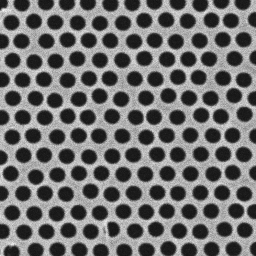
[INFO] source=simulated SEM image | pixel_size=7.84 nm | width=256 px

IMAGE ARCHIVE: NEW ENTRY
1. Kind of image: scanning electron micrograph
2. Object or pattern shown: a regular array of holes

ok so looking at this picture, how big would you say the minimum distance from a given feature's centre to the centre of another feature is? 162 nanometers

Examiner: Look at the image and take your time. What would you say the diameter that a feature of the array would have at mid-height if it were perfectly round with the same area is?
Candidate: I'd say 127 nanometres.